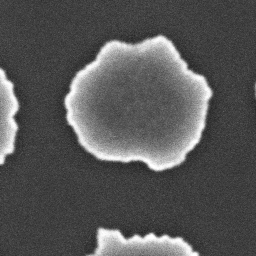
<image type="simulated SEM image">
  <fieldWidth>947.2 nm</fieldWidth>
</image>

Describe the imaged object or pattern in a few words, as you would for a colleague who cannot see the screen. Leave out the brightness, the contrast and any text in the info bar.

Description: raised bodies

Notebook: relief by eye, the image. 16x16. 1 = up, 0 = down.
0000000000000000
0000000000000000
0000000000000000
0000001111100000
0000011111110000
1000011111111000
1000111111111000
1000111111111000
1000011111110000
0000001111110000
0000000000000000
0000000000000000
0000000000000000
0000000000000000
0000000000000000
0000001111110000